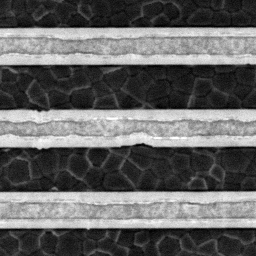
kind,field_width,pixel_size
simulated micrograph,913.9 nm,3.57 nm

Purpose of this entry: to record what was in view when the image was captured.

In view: one or a few lines or trenches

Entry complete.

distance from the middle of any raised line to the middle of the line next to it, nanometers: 292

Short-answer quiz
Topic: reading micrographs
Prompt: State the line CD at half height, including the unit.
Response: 104 nm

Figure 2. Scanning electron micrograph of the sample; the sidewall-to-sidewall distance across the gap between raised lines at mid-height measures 188 nanometers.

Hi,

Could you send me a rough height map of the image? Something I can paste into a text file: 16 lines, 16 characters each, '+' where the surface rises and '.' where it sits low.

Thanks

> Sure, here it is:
................
................
++++++++++++++++
++++++++++++++++
................
................
................
++++++++++++++++
++++++++++++++++
................
................
................
++++++++++++++++
++++++++++++++++
................
................